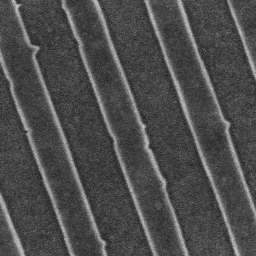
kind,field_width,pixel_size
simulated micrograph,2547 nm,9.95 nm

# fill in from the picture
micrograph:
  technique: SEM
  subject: one or a few lines or trenches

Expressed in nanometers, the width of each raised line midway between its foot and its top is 320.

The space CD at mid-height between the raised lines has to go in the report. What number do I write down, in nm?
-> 462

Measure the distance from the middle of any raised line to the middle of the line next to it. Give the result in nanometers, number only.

776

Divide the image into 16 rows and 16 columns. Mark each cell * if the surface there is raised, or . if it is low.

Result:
*...**...**...**
*...***...**...*
**...**...**...*
**...**...**....
**....**...**...
.**...**...**...
.**...**...***..
.***...**...**..
..**...**...**..
..**...**....**.
...**...**...**.
...**...**...**.
...**...***...**
....**...**...**
*...**...**...**
*...***...**...*